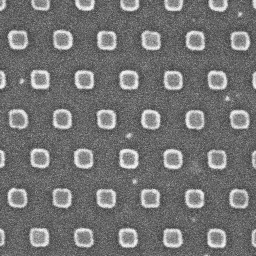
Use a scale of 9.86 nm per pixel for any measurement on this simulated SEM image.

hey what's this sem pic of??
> a regular array of raised bodies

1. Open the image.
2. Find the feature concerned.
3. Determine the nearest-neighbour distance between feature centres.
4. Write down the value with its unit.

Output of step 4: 435 nm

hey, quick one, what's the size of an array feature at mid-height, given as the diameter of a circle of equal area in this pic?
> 0.182 um